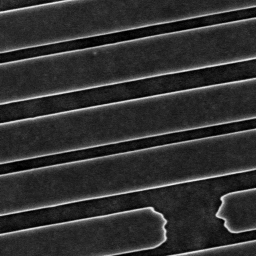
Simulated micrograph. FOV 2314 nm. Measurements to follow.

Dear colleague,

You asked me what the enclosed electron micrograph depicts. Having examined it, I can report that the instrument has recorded parallel lines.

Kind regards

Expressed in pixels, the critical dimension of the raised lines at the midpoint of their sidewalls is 39.5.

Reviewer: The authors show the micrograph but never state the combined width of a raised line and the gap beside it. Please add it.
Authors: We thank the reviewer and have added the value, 496 nanometers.